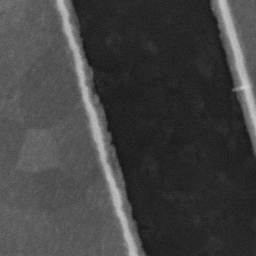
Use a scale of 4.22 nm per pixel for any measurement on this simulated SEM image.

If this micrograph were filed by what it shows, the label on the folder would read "one or a few lines or trenches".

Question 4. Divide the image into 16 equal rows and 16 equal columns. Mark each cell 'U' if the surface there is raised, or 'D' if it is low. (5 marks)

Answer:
UUUUDDDDDDDDDDUU
UUUUDDDDDDDDDDUU
UUUUDDDDDDDDDDDU
UUUUUDDDDDDDDDDU
UUUUUDDDDDDDDDDU
UUUUUDDDDDDDDDDU
UUUUUUDDDDDDDDDD
UUUUUUDDDDDDDDDD
UUUUUUDDDDDDDDDD
UUUUUUDDDDDDDDDD
UUUUUUUDDDDDDDDD
UUUUUUUDDDDDDDDD
UUUUUUUDDDDDDDDD
UUUUUUUUDDDDDDDD
UUUUUUUUDDDDDDDD
UUUUUUUUDDDDDDDD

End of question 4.